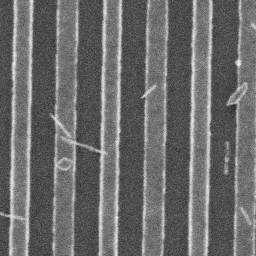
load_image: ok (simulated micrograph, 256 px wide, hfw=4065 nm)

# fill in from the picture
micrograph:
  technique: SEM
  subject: lines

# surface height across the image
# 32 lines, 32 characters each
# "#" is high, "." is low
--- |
..##...###...##....##...##....##
..##...###...##...###...##....##
..##...###...##...###...##....##
..##...###...##...###...##....##
..##...###...##...###...##....##
..##...###...##...###...##....##
..##...###...##...###...##....##
..##...###...##...###...##....##
..##...##....##...###...##....##
..##...##....##...###...##....##
..##...###...##...###...##....##
..##...##....##...###...##...###
..##...##....##...###...##...###
..##...##....##...###...##....##
..##...##....##...###...##....##
..##...##....##...###...##....##
.###...##....##...###...##....##
.###...##....##...###...##....##
.###...##....##...###...##....##
.###...##....##...###...##....##
.###...##....##...###...##....##
.###...##....##...###...##....##
.###...##....##...###...##....##
.###...##....##...###...##....##
.###...##....##...###...##....##
.###...##....##...##....##....##
.###...##...###...##....##...###
.###...##...###...##....##...###
.###...##...###...##....##...###
.###...##...###...##....##...###
.###...##...###...##....##...###
.##....##...###...##....##...###